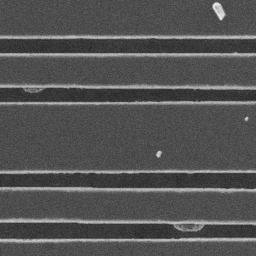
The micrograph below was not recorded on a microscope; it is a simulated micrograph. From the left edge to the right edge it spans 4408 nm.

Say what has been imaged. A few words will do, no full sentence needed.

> lines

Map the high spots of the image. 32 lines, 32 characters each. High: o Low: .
oooooooooooooooooooooooooooooooo
oooooooooooooooooooooooooooooooo
oooooooooooooooooooooooooooooooo
oooooooooooooooooooooooooooooooo
oooooooooooooooooooooooooooooooo
................................
................................
oooooooooooooooooooooooooooooooo
oooooooooooooooooooooooooooooooo
oooooooooooooooooooooooooooooooo
oooooooooooooooooooooooooooooooo
................................
................................
oooooooooooooooooooooooooooooooo
oooooooooooooooooooooooooooooooo
oooooooooooooooooooooooooooooooo
oooooooooooooooooooooooooooooooo
oooooooooooooooooooooooooooooooo
oooooooooooooooooooooooooooooooo
oooooooooooooooooooooooooooooooo
oooooooooooooooooooooooooooooooo
oooooooooooooooooooooooooooooooo
................................
ooo.............................
oooooooooooooooooooooooooooooooo
oooooooooooooooooooooooooooooooo
oooooooooooooooooooooooooooooooo
oooooooooooooooooooooooooooooooo
................................
................................
oooooooooooooooooooooooooooooooo
oooooooooooooooooooooooooooooooo